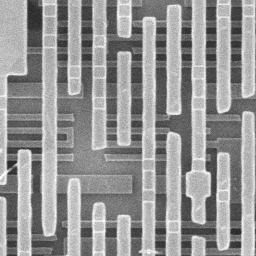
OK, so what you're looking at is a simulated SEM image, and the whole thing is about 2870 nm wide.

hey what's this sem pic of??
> wiring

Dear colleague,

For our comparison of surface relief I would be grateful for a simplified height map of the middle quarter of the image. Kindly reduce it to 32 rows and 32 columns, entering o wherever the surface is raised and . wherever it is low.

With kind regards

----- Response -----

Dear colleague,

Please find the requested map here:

.ooo...ooo...oooo...ooo...ooo...
.ooo...ooo...oooo...ooo...ooo...
.ooo...ooo...oooo...ooo...ooo...
.ooo...ooo...oooo...ooo...ooo...
.ooo...ooo...oooo...ooo...ooo...
.ooo...ooo...oooo...ooo...ooo...
.ooo...ooo...oooo...ooo...ooo...
.oo....ooo...oooo...ooo...ooo...
.......ooo...oooo...ooo...ooo...
.......ooo...oooo...ooo...ooo...
.......ooo...oooo...ooo...ooo...
.......ooo...oooo...ooo...ooo...
.......ooo...oooo...ooo.........
.......ooo...oooo...ooo.........
.......ooo...oooo...ooo.........
.......ooo...oooo...oo..........
.......ooo...oooo...oo..........
.......ooo...oooo...ooo...oo....
.......ooo...oooo...ooo...ooo...
.......ooo...oooo...ooo...ooo...
.......ooo..........ooo...ooo...
....................ooo...ooo...
....................ooo...ooo...
....................oo....ooo...
....................oo....ooo...
....................oo....ooo...
....................ooo...ooo...
....................ooo...ooo..o
....................ooo...ooo..o
.ooo................ooo...ooo..o
.ooo................ooo...ooo..o
.ooo................ooo...ooo..o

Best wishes